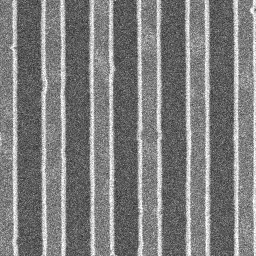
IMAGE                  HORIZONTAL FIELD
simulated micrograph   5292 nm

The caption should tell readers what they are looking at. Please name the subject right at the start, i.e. parallel lines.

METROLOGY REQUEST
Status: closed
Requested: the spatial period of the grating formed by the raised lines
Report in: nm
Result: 994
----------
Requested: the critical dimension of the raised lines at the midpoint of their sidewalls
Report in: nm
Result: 419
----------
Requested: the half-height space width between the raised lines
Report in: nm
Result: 576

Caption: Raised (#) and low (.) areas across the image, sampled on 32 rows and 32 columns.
##...###...###...###....##....##
##...###...###...###....##....##
##...###...###...###....##....##
##...###...###...###...###....##
##...###...###...###...###....##
##...###...###...###...###....##
##...###...###...###....##....##
##...###...###...###....##....##
##...###...###...###....##....##
##...###...###....##....##....##
##....##...###....##....##....##
##....##...###....##....##....##
##....##....##....##....##....##
##...###....##....##....##....##
##...###....##....##....##....##
##....##....##....##....##....##
##....##....##...###....##....##
##....##...###...###....##....##
##....##...###....##....##....##
##....##....##....##....##....##
##...###....##....##....##....##
##...###....##....##....##....##
##....##....##....##...###...###
##....##....##...###...###...###
##....##....##...###...###...###
##....##....##...###...###...###
##....##....##....##...###...###
##....##....##....##....##....##
##....##....##....##....##....##
##....##....##....##....##....##
##....##....##....##....##....##
##....##....##...###....##....##